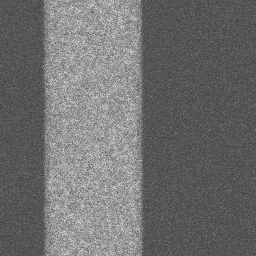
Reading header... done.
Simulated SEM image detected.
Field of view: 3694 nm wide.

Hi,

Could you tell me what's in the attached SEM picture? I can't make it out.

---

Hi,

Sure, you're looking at one or a few lines or trenches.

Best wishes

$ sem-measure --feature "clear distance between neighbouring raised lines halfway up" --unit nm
1350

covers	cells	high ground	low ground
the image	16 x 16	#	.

###......#######
###......#######
###......#######
###......#######
###......#######
###......#######
###......#######
###......#######
###......#######
###......#######
###......#######
###......#######
###......#######
###......#######
###......#######
###......#######